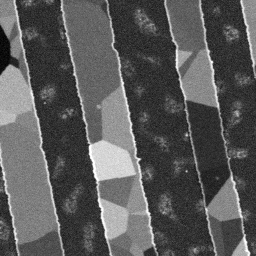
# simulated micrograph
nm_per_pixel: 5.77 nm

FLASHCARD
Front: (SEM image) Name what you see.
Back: one or a few lines or trenches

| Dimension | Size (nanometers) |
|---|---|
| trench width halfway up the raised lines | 269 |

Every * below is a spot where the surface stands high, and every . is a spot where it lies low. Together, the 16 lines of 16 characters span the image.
*...***...***..*
*...***....**..*
*...***....**...
**..***....**...
**...***...**...
**...***...**...
**...***....**..
**...***....**..
***..***....**..
***...***...**..
***...***...**..
***...***....**.
.**...***....**.
.***..***....**.
.***...**....**.
.***...***...**.